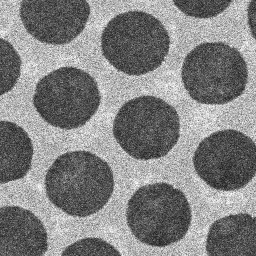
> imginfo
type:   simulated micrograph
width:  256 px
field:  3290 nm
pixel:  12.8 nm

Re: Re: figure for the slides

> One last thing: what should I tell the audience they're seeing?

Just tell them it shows holes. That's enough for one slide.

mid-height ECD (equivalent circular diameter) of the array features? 65.8 px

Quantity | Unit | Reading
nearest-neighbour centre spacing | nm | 1090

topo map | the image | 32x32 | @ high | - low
@@@--------@@@@@@@@@@@-------@@-
@@---------@@@@@--@@@@@-----@@@-
@@@--------@@@------@@@@@@@@@@@-
@@@--------@@--------@@@@@@@@@@-
@@@@------@@@--------@@@@@@@@@@@
-@@@@@--@@@@@--------@@@@---@@@@
--@@@@@@@@@@@--------@@@------@@
---@@@@@@@@@@--------@@--------@
---@@@@---@@@@------@@@--------@
--@@@@-----@@@@@@@@@@@@--------@
--@@@-------@@@@@@@@@@@--------@
-@@@--------@@@@@@@@@@@-------@@
@@@@---------@@@----@@@@-----@@@
@@@@--------@@@-------@@@@@@@@@@
@@@@@-------@@--------@@@@@@@@@@
--@@@@-----@@@--------@@@@@@@@@@
---@@@@@@@@@@@--------@@@@@---@@
----@@@@@@@@@@@-------@@@-------
----@@@@@@@@@@@-------@@@-------
----@@@-----@@@@-----@@@--------
----@@-------@@@@@@@@@@@--------
---@@@--------@@@@@@@@@@@-------
--@@@@--------@@@@@@@@@@@------@
@@@@@@--------@@@-----@@@@@---@@
@@@@@@--------@@-------@@@@@@@@@
@@@@@@@------@@@--------@@@@@@@@
----@@@@----@@@@--------@@@@@@@@
-----@@@@@@@@@@@--------@@@-----
------@@@@@@@@@@--------@@------
------@@@@@@@@@@@------@@@------
------@@@-----@@@@---@@@@@------
------@@-------@@@@@@@@@@@------